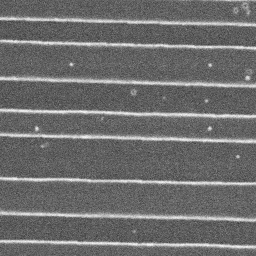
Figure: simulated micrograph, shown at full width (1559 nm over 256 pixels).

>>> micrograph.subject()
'lines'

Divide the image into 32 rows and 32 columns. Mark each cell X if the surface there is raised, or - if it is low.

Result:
XXXXXXXXXXXXXXXXXXXXXXXXXXXXXXXX
XXXXXXXXXXXXXXXXXXXXXXXXXXXXXXXX
----XXXXXXXXXXXXXXXXXXXXXXXXXXXX
--------------------------------
--------------------------------
XXXXXXXXXXXXX-------------------
XXXXXXXXXXXXXXXXXXXXXXXXXXXXXXXX
XXXXXXXXXXXXXXXXXXXXXXXXXXXXXXXX
XXXXXXXXXXXXXXXXXXXXXXXXXXXXXXXX
XXXXXXXXXXXXXXXXXXXXXXXXXXXXXXXX
----------------------XXXXXXXXXX
--------------------------------
--------------------------------
--------------------------------
XXXXXXXXXXXXXXXXXXXXXXXXXXXXXX--
XXXXXXXXXXXXXXXXXXXXXXXXXXXXXXXX
XXXXXXXXXXXXXXXXXXXXXXXXXXXXXXXX
-----------------------XXXXXXXXX
--------------------------------
--------------------------------
--------------------------------
--------------------------------
XXXXXXXXXX----------------------
XXXXXXXXXXXXXXXXXXXXXXXXXXXXXXXX
XXXXXXXXXXXXXXXXXXXXXXXXXXXXXXXX
XXXXXXXXXXXXXXXXXXXXXXXXXXXXXXXX
XXXXXXXXXXXXXXXXXXXXXXXXXXXXXXXX
------------------------------XX
--------------------------------
--------------------------------
XXXXXXXXXXXXXXXXX---------------
XXXXXXXXXXXXXXXXXXXXXXXXXXXXXXXX